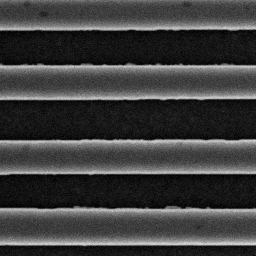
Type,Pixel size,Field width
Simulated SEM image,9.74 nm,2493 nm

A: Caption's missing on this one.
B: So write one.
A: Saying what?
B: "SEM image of lines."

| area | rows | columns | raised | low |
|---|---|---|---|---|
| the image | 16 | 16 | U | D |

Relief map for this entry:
UUUUUUUUUUUUUUUU
UUUUUUUUUUUUUUUU
DDDDDDDDDDDDDDDD
DDDDDDDDDDDDDDDD
UUUUUUUUUUUUUUUU
UUUUUUUUUUUUUUUU
DDDDDDDDDDDDDDDD
DDDDDDDDDDDDDDDD
DDDDDDDDDDDDDDDD
UUUUUUUUUUUUUUUU
UUUUUUUUUUUUUUUU
DDDDDDDDDDDDDDDD
DDDDDDDDDDDDDDDD
UUUUUUUUUUUUUUUU
UUUUUUUUUUUUUUUU
DDDDDDDDDDDDDDDD